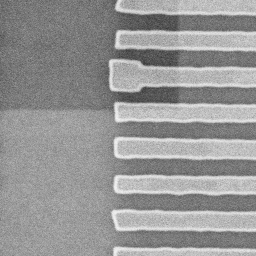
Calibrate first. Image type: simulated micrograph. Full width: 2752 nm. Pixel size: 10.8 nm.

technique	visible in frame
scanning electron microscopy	wiring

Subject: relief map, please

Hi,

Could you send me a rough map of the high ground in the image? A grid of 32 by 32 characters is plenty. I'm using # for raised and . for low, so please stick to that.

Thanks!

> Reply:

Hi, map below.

...............#################
.................##.############
................................
................................
...............#################
...............#################
................................
................................
..............#######...........
..............##################
..............##################
................................
................................
...............#################
...............#################
................................
................................
...............########.........
..............##################
...............#################
................................
................................
...............#################
..............##################
................................
................................
...............#####............
..............##################
...............#################
................................
................................
..............##################